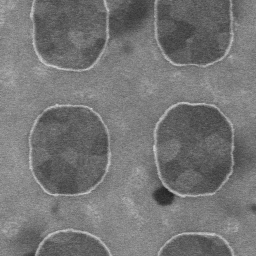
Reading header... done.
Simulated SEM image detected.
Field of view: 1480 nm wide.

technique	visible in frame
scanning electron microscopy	raised bodies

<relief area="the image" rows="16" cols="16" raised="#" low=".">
..#####...####..
..#####...####..
..#####...####..
..####....####..
................
................
...........#....
..####....####..
..#####...#####.
..#####...####..
..#####...####..
..####....####..
................
................
....#...........
..#####...####..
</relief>